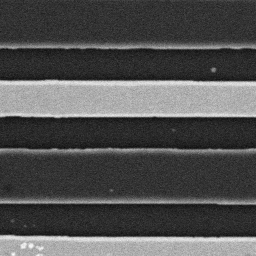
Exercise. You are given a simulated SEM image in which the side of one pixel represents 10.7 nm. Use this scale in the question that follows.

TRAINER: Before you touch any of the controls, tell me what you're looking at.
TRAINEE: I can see lines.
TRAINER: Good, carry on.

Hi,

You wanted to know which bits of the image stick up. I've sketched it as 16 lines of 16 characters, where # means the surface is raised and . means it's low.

################
################
################
................
................
################
################
................
................
################
################
################
################
................
................
################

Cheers